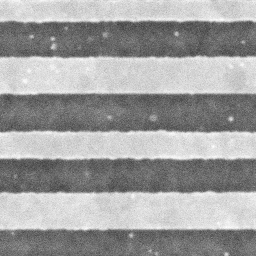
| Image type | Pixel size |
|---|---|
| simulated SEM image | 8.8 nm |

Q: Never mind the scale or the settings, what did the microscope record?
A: lines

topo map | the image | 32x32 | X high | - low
XXXXXXXXXXXXXXXXXXXXXXXXXXXXXXXX
XXXXXXXXXXXXXXXXXXXXXXXXXXXXXXXX
XXXXXXXXXXXXXXXXXXXXXXXXXXXXXXXX
--------------------------------
--------------------------------
--------------------------------
--------------------------------
XXXXXXXXXXXXXXXXXXXXXXXXXXXXXXXX
XXXXXXXXXXXXXXXXXXXXXXXXXXXXXXXX
XXXXXXXXXXXXXXXXXXXXXXXXXXXXXXXX
XXXXXXXXXXXXXXXXXXXXXXXXXXXXXXXX
XXXXXXXXXXXXXXXXXXXXXXXXXXXXXXXX
--------------------------------
--------------------------------
--------------------------------
--------------------------------
-X--XXX------XX--XXXX-----------
XXXXXXXXXXXXXXXXXXXXXXXXXXXXXXXX
XXXXXXXXXXXXXXXXXXXXXXXXXXXXXXXX
XXXXXXXXXXXXXXXXXXXXXXXXXXXXXXXX
--------------------------------
--------------------------------
--------------------------------
--------------------------------
XXXXXXXXXXXXXXXXXXXXXXXXXXXXXXXX
XXXXXXXXXXXXXXXXXXXXXXXXXXXXXXXX
XXXXXXXXXXXXXXXXXXXXXXXXXXXXXXXX
XXXXXXXXXXXXXXXXXXXXXXXXXXXXXXXX
XXXXXXXXXXXXXXXXXXXXXXXXXXXXXXXX
--------------------------------
--------------------------------
--------------------------------